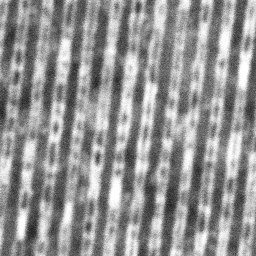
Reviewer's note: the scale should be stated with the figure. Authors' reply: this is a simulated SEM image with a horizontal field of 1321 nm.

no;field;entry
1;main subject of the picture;parallel lines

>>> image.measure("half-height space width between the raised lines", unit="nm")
67.8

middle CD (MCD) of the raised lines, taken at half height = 48 nm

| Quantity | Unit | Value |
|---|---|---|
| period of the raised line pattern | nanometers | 116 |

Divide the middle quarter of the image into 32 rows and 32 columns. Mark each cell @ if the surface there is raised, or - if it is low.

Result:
@---@@@---@@----@@---@@----@@---
@---@@----@@----@@---@@----@@---
@---@@@---@@---@@@---@@----@@---
----@@----@@---@@----@@----@@---
----@@---@@@---@@----@@----@----
----@@---@@@---@@----@@----@----
----@@---@@@---@@----@@----@----
----@@---@@@---@@----@@---@@----
----@@---@@----@@---@@@---@@----
---@@@---@@----@@---@@----@@----
---@@@---@@---@@@---@@----@@---@
---@@----@@---@@@---@@----@@---@
---@@----@@---@@@---@@----@@---@
---@@---@@@---@@@---@@----@@---@
---@@---@@@---@@----@@----@----@
---@@---@@@---@@---@@@---@@----@
---@@---@@----@@---@@@---@@----@
--@@----@@----@@---@@----@@----@
--@@@---@@----@@---@@----@@---@@
--@@----@@---@@----@@----@@---@@
--@@----@@---@@-----@----@@---@@
--@@---@@@---@@----@@---@@----@@
--@@---@@@---@@---@@@---@@----@@
--@@---@@@---@@---@@@---@@----@@
--@@---@@@---@@---@@@---@@----@@
--@----@@----@@---@@@---@@----@@
-@@----@@---@@@---@@@--@@@----@@
-@@----@@---@@@---@@---@@@----@@
-@@----@@---@@----@@---@@@---@@-
-@@---@@@---@@----@@---@@@---@@-
-@@----@@---@@----@@----@----@@-
-@@---@@@---@@----@@---@@----@@-